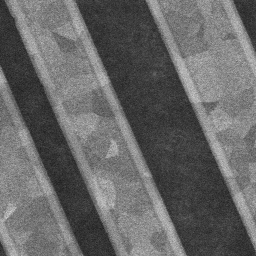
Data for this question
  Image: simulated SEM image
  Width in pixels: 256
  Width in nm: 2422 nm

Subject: one or a few lines or trenches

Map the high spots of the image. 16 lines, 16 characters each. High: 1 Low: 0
0111000000111100
0111100000111110
0011100000011110
0011110000011111
0001110000011111
0001111000001111
1000111000001111
1000111000000111
1000111100000111
1100011100000011
1100011110000011
1110001110000001
1110001111000001
1111000111000001
1111000111100000
0111100011100000